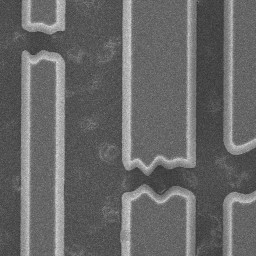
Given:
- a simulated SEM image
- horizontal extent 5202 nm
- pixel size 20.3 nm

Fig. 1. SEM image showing one or a few lines or trenches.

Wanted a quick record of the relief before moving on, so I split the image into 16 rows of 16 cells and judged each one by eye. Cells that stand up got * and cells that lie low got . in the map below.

..**....****..**
..**....****..**
........****..**
........****..**
..**....****..**
..**....****..**
..**....****..**
..**....****..**
..**....****..**
..**....****....
..**............
..**............
..**....****...*
..**....****..**
..**....****..**
..**....****..**